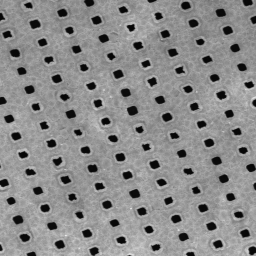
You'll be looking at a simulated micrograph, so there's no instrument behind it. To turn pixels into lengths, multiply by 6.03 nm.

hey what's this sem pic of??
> a regular array of holes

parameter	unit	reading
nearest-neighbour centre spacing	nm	116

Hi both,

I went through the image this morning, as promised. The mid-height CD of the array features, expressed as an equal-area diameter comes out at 49.5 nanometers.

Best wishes